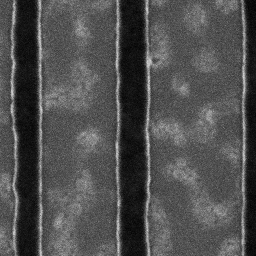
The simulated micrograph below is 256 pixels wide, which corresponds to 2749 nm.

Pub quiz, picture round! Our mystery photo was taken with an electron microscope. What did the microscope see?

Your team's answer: one or a few lines or trenches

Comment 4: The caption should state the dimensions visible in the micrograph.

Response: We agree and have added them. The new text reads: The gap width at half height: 0.918 microns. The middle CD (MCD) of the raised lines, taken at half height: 318 nanometers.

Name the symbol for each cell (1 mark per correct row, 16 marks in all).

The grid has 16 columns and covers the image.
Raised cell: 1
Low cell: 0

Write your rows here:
0110000110000001
0100000110000001
0110000110000001
0110000110000001
0110000110000001
0110000110000001
0110000110000001
0110000110000001
0110000110000001
0110000110000001
0110000110000001
0110000110000001
0110000110000001
0110000110000001
0110000110000001
0110000110000001